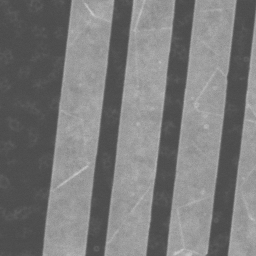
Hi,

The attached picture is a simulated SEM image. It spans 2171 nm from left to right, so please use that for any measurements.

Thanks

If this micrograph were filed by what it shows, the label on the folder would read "one or a few lines or trenches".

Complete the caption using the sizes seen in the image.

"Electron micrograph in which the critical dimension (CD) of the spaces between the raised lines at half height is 176 nanometers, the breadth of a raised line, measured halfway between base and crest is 344 nanometres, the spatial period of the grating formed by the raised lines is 0.514 µm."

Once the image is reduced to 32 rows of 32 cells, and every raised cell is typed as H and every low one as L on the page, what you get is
LLLLLLLLLHHHHHLLLHHHHHLLHHHHHLLL
LLLLLLLLLHHHHHLLLHHHHHLLHHHHHLLL
LLLLLLLLLHHHHHLLHHHHHHLLHHHHHLLL
LLLLLLLLLHHHHHLLHHHHHLLLHHHHHLLL
LLLLLLLLLHHHHHLLHHHHHLLLHHHHHLLL
LLLLLLLLHHHHHHLLHHHHHLLLHHHHHLLL
LLLLLLLLHHHHHHLLHHHHHLLLHHHHHLLH
LLLLLLLLHHHHHLLLHHHHHLLLHHHHHLLH
LLLLLLLLHHHHHLLLHHHHHLLLHHHHHLLH
LLLLLLLLHHHHHLLLHHHHHLLHHHHHLLLH
LLLLLLLLHHHHHLLLHHHHHLLHHHHHLLLH
LLLLLLLLHHHHHLLHHHHHHLLHHHHHLLLH
LLLLLLLLHHHHHLLHHHHHLLLHHHHHLLLH
LLLLLLLHHHHHHLLHHHHHLLLHHHHHLLLH
LLLLLLLHHHHHHLLHHHHHLLLHHHHHLLLH
LLLLLLLHHHHHLLLHHHHHLLLHHHHHLLLH
LLLLLLLHHHHHLLLHHHHHLLLHHHHHLLHH
LLLLLLLHHHHHLLLHHHHHLLLHHHHHLLHH
LLLLLLLHHHHHLLLHHHHHLLHHHHHLLLHH
LLLLLLLHHHHHLLLHHHHHLLHHHHHLLLHH
LLLLLLLHHHHHLLHHHHHHLLHHHHHLLLHH
LLLLLLLHHHHHLLHHHHHLLLHHHHHLLLHH
HLLLLLHHHHHHLLHHHHHLLLHHHHHLLLHH
LLLLLLHHHHHHLLHHHHHLLLHHHHHLLLHH
LLLLLLHHHHHLLLHHHHHLLLHHHHHLLHHH
LLLLLLHHHHHLLLHHHHHLLLHHHHHLLHHH
LLLLLLHHHHHLLLHHHHHLLHHHHHHLLHHH
LLLLLLHHHHHLLLHHHHHLLHHHHHLLLHHH
LLLLLLHHHHHLLLHHHHHLLHHHHHLLLHHH
LLLLLLHHHHHLLHHHHHLLLHHHHHLLLHHH
LLLLLLHHHHHLLHHHHHLLLHHHHHLLLHHH
LLLLLHHHHHHLLHHHHHLLLHHHHHLLLHHH